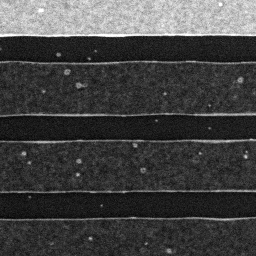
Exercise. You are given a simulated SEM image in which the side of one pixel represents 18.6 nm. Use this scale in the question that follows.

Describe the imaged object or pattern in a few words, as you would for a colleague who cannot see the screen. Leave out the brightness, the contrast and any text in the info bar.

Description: wiring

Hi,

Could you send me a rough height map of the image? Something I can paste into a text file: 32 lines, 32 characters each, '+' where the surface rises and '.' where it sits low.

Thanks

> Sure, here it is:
++++++++++++++++++++++++++++++++
++++++++++++++++++++++++++++++++
++++++++++++++++++++++++++++++++
++++++++++++++++++++++++++++++++
................................
................................
................................
................................
++++++++++++++++++++++++++++++++
++++++++++++++++++++++++++++++++
++++++++++++++++++++++++++++++++
++++++++++++++++++++++++++++++++
++++++++++++++++++++++++++++++++
++++++++++++++++++++++++++++++++
................................
................................
................................
................................
++++++++++++++++++++++++++++++++
++++++++++++++++++++++++++++++++
++++++++++++++++++++++++++++++++
++++++++++++++++++++++++++++++++
++++++++++++++++++++++++++++++++
++++++++++++++++++++++++++++++++
................................
................................
................................
......+++++++++++++++++++++..+++
++++++++++++++++++++++++++++++++
++++++++++++++++++++++++++++++++
++++++++++++++++++++++++++++++++
++++++++++++++++++++++++++++++++